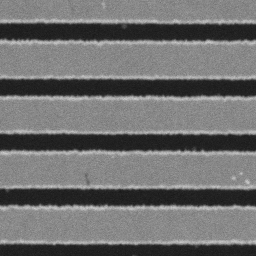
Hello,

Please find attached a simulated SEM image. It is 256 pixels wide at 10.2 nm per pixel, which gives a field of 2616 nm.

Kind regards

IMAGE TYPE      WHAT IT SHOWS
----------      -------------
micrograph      lines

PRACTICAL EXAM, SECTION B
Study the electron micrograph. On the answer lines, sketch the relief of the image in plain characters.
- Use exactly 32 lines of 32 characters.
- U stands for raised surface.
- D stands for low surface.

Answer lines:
UUUUUUUUUUUUUUUUUUUUUUUUUUUUUUUU
UUUUUUUUUUUUUUUUUUUUUUUUUUUUUUUU
UUUUUUUUUUUUUUUUUUUUUUUUUUUUUUUU
DDDDDDDDDDDDDDDDDDDDDDDDDDDDDDDD
DDDDDDDDDDDDDDDDDDDDDDDDDDDDDDDD
UUUUUUUUUUUUUUUUUUUUUUUUUUUUUUUU
UUUUUUUUUUUUUUUUUUUUUUUUUUUUUUUU
UUUUUUUUUUUUUUUUUUUUUUUUUUUUUUUU
UUUUUUUUUUUUUUUUUUUUUUUUUUUUUUUU
UUUUUUUUUUUUUUUUUUUUUUUUUUUUUUUU
DDDDDDDDDDDDDDDDDDDDDDDDDDDDDDDD
DDDDDDDDDDDDDDDDDDDDDDDDDDDDDDDD
UUUUUUUUUUUUUUUUUUUUUUUUUUUUUUUU
UUUUUUUUUUUUUUUUUUUUUUUUUUUUUUUU
UUUUUUUUUUUUUUUUUUUUUUUUUUUUUUUU
UUUUUUUUUUUUUUUUUUUUUUUUUUUUUUUU
UUUUUUUUUUUUUUUUUUUUUUUUUUUUUUUU
DDDDDDDDDDDDDDDDDDDDDDDDDDDDDDDD
DDDDDDDDDDDDDDDDDDDDDDDDDDDDDDDD
UUUUUUUUUUUUUUUUUUUUUUUUUUUUUUUU
UUUUUUUUUUUUUUUUUUUUUUUUUUUUUUUU
UUUUUUUUUUUUUUUUUUUUUUUUUUUUUUUU
UUUUUUUUUUUUUUUUUUUUUUUUUUUUUUUU
UUUUUUUUUUUUUUUUUUUUUUUUUUUUUUUU
DDDDDDDDDDDDDDDDDDDDDDDDDDDDDDDD
DDDDDDDDDDDDDDDDDDDDDDDDDDDDDDDD
UUUUUUUUUUUUUUUUUUUUUUUUUUUUUUUU
UUUUUUUUUUUUUUUUUUUUUUUUUUUUUUUU
UUUUUUUUUUUUUUUUUUUUUUUUUUUUUUUU
UUUUUUUUUUUUUUUUUUUUUUUUUUUUUUUU
DDDDDDUDDDDDDDDDUDDDUUDDUUUUUDUU
DDDDDDDDDDDDDDDDDDDDDDDDDDDDDDDD